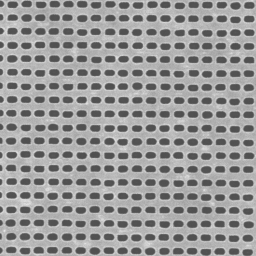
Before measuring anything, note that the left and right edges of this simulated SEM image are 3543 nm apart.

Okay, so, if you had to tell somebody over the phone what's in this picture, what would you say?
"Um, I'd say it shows a regular array of holes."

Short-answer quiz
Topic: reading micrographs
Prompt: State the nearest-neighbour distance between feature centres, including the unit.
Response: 182 nm